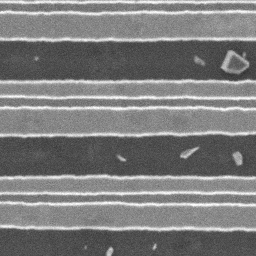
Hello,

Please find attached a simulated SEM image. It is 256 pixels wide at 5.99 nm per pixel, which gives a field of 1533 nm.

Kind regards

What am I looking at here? lines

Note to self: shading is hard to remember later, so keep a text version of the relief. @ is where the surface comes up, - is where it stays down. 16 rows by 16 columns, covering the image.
@@@@@@@@@@@@@@@@
@@@@@@@@@@@@@@@@
---@@@@@@@------
----------------
----------------
@@@@@@@@@@@@@@@@
@@@@@@@@@@@@@@@@
@@@@@@@@@@@@@@@@
----------------
----------------
----------------
@@@@@@@@@@@@@@@@
@@@@@@@@@@@@@@@@
@@@@@@@@@@@@@@@@
----------------
----------------